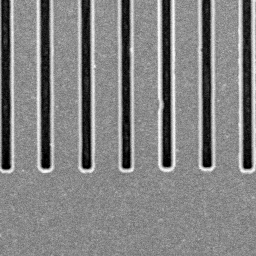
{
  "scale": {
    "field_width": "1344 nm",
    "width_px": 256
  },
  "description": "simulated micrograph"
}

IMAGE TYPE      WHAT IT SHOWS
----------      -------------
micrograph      parallel lines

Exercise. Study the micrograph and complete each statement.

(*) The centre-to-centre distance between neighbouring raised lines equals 0.211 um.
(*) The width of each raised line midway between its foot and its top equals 152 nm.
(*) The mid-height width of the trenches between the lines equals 58.4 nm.